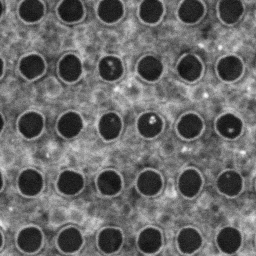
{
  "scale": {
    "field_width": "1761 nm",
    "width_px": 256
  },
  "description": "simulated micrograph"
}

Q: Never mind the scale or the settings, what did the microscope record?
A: a regular array of raised bodies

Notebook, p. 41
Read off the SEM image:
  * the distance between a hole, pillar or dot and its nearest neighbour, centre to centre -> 0.272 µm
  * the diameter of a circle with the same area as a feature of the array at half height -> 28.1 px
